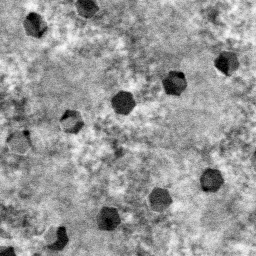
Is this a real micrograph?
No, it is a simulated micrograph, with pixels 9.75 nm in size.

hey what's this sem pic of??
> a regular array of raised bodies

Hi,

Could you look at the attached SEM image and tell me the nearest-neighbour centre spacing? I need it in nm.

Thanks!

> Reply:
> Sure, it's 540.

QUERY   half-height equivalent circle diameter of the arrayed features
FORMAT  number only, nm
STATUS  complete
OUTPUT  256